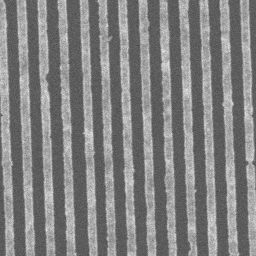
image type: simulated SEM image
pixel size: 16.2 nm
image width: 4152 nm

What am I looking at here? parallel lines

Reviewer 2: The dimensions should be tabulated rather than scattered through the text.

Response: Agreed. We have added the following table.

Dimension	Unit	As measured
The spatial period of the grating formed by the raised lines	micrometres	0.329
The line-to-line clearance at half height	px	13.5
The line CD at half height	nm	116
